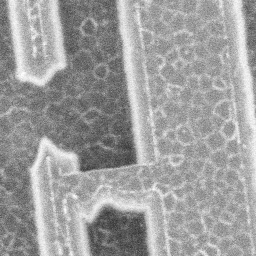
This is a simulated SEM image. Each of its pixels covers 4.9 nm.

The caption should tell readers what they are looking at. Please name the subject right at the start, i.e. one or a few lines or trenches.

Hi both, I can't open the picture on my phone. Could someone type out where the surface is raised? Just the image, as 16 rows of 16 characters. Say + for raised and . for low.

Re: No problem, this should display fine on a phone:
.++.....+++++++.
.+++....+++++++.
.+++....+++++++.
.+++....+++++++.
.++.....+++++++.
........++++++++
........++++++++
........++++++++
.........+++++++
..++.....+++++++
..+++..+++++++++
..++++++++++++++
..++++++++++++++
..++++...+++++++
...++....+++++++
...++....+++++++